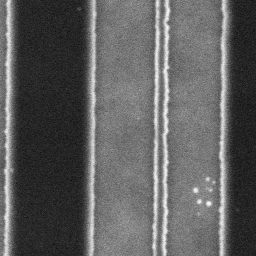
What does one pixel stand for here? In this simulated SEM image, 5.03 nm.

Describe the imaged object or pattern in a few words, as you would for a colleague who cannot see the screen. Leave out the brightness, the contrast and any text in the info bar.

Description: lines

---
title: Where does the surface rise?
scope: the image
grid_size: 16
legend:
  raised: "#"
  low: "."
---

######....#...##
######........##
######........##
######........##
######........##
######........##
######........##
######........##
######........##
######........##
######........##
######........##
######........##
######........##
######........##
######........##